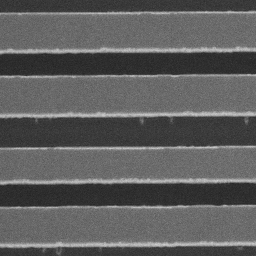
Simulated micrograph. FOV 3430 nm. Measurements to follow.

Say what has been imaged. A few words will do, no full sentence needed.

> lines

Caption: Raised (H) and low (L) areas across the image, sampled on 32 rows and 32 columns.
LLLLLLLLLLLLLLLLLLLLLLLLLLLLLLLL
LLLLLLLLLLLLLLLLLLLLLLLLLLLLLLLL
HHHHHHHHHHHHHHHHHHHHHHHHHHHHHHHH
HHHHHHHHHHHHHHHHHHHHHHHHHHHHHHHH
HHHHHHHHHHHHHHHHHHHHHHHHHHHHHHHH
HHHHHHHHHHHHHHHHHHHHHHHHHHHHHHHH
HHHHHHHHHHHHHHHHHHHHHHHHHLLHLLLL
LLLLLLLLLLLLLLLLLLLLLLLLLLLLLLLL
LLLLLLLLLLLLLLLLLLLLLLLLLLLLLLLL
HLHLLHLHHLHHHHHHHHHHHHHHHHHHHHHH
HHHHHHHHHHHHHHHHHHHHHHHHHHHHHHHH
HHHHHHHHHHHHHHHHHHHHHHHHHHHHHHHH
HHHHHHHHHHHHHHHHHHHHHHHHHHHHHHHH
HHHHHHHHHHHHHHHHHHHHHHHHHHHHHHHH
HHHHHHHHHHHHHHHHHLLLLLLLLLLLLLLL
LLLLLLLLLLLLLLLLLLLLLLLLLLLLLLLL
LLLLLLLLLLLLLLLLLLLLLLLLLLLLLLLL
LLLLLLLLLLLLLLLLLLLLLLLLLLLLLLLL
LLLLLLLLLLLLLLLLLHHHHHHHHHHHHHHH
HHHHHHHHHHHHHHHHHHHHHHHHHHHHHHHH
HHHHHHHHHHHHHHHHHHHHHHHHHHHHHHHH
HHHHHHHHHHHHHHHHHHHHHHHHHHHHHHHH
HHHHHHHHHHHHHHHHHHHHHHHHHHHHHHHH
LLLLLLLLLLLLLLLLLLLLLLLLLLLLLLLL
LLLLLLLLLLLLLLLLLLLLLLLLLLLLLLLL
LLLLLLLLLLLLLLLLLLLLLLLLLLLLLLLL
HHHHHHHHHHHHHHHHHHHHHHHHHHHHHHHH
HHHHHHHHHHHHHHHHHHHHHHHHHHHHHHHH
HHHHHHHHHHHHHHHHHHHHHHHHHHHHHHHH
HHHHHHHHHHHHHHHHHHHHHHHHHHHHHHHH
HHHHHHHHHHHHHHHHHHHHHHHHHHHHHHHH
LLLLLLLLLLLLLLLLLLLLLLLLLLLLLLLL